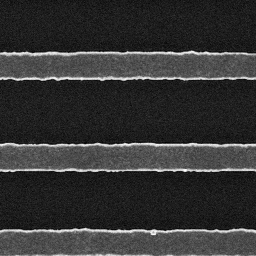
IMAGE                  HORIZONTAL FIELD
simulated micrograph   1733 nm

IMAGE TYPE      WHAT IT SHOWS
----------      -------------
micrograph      lines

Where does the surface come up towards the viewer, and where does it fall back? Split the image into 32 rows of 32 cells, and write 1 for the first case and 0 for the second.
00000000000000000000000000000000
00000000000000000000000000000000
00000000000000000000000000000000
00000000000000000000000000000000
00000000000000000000000000000000
00000000000000000000000000000000
00000000000000000000000100000000
11111111111111111111111111111111
11111111111111111111111111111111
11111111111111111111111111111111
00000000000000000000000000000000
00000000000000000000000000000000
00000000000000000000000000000000
00000000000000000000000000000000
00000000000000000000000000000000
00000000000000000000000000000000
00000000000000000000000000000000
00000000000000000000000000000000
11111111111111111111111111111111
11111111111111111111111111111111
11111111111111111111111111111111
00000000000000000000000000000000
00000000000000000000000000000000
00000000000000000000000000000000
00000000000000000000000000000000
00000000000000000000000000000000
00000000000000000000000000000000
00000000000000000000000000000000
00000000000000000000000000000000
11111111111111111111111111111111
11111111111111111111111111111111
11111111111111111111111111111111